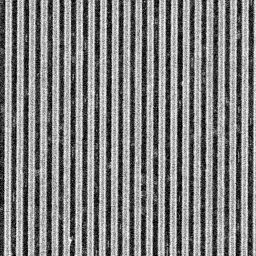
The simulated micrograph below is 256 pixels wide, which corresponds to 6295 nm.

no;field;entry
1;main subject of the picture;parallel lines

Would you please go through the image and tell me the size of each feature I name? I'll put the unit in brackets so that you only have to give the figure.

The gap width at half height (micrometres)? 0.157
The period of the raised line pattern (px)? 11.8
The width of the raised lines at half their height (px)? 5.5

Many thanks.